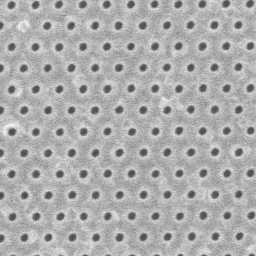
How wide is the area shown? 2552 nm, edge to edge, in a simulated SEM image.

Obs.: a regular array of holes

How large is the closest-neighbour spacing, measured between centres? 236 nanometers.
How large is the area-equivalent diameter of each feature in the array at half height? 84.2 nm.